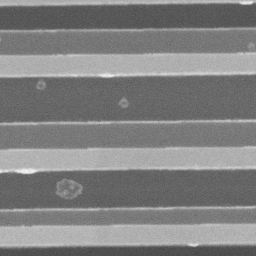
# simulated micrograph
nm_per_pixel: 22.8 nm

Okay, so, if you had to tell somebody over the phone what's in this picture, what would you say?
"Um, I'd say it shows lines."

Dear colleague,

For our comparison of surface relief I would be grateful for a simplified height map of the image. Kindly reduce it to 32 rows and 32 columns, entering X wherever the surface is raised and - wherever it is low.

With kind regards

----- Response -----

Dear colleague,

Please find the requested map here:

XX-X----------------------------
--------------------------------
--------------------------------
--------------------------------
XXXXXXXXXXXXXXXXXXXXXXXXXXXXXXXX
XXXXXXXXXXXXXXXXXXXXXXXXXXXXXXXX
XXXXXXXXXXXXXXXXXXXXXXXXXXXXXXXX
XXXXXXXXXXXXXXXXXXXXXXXXXXXXXXXX
XXXXXXXXXXXXXXXXXXXXXXXXXXXXXXXX
-------------X------------------
--------------------------------
--------------------------------
--------------------------------
--------------------------------
--------------------------------
--XXXXXXXXXXXXXXXXXXXXXXXXXXXXXX
XXXXXXXXXXXXXXXXXXXXXXXXXXXXXXXX
XXXXXXXXXXXXXXXXXXXXXXXXXXXXXXXX
XXXXXXXXXXXXXXXXXXXXXXXXXXXXXXXX
XXXXXXXXXXXXXXXXXXXXXXXXXXXXXXXX
XXXXXXXXXXXXXXXXXXXXXXXXXXXXXXXX
X-XX----------------------------
--------------------------------
--------------------------------
--------------------------------
--------------------------------
XXXXXXXXXXXXXXXXXXXXXXXXXXXXXXXX
XXXXXXXXXXXXXXXXXXXXXXXXXXXXXXXX
XXXXXXXXXXXXXXXXXXXXXXXXXXXXXXXX
XXXXXXXXXXXXXXXXXXXXXXXXXXXXXXXX
XXXXXXXXXXXXXXXXXXXXX--XX-------
--------------------------------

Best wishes